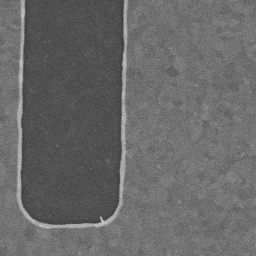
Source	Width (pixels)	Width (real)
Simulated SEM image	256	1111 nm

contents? one or a few lines or trenches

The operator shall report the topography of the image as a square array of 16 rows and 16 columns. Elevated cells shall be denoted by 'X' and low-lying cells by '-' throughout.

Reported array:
X-------XXXXXXXX
X-------XXXXXXXX
X-------XXXXXXXX
X-------XXXXXXXX
X-------XXXXXXXX
X-------XXXXXXXX
X-------XXXXXXXX
X-------XXXXXXXX
X-------XXXXXXXX
X-------XXXXXXXX
X-------XXXXXXXX
X-------XXXXXXXX
X-------XXXXXXXX
XX-----XXXXXXXXX
XXXXXXXXXXXXXXXX
XXXXXXXXXXXXXXXX